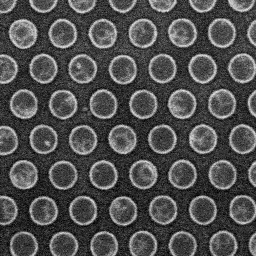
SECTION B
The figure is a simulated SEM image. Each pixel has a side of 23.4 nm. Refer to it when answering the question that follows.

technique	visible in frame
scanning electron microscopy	a regular array of raised bodies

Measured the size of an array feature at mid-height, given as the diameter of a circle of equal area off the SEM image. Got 629 nm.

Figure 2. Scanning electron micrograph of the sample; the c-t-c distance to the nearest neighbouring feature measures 0.924 microns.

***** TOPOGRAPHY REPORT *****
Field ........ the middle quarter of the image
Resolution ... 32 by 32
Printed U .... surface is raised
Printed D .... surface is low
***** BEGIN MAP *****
DUUUUUUUDDDDUUUUUUDDDUUUUUUUDDDU
DUUUUUUUDDDDUUUUUUDDDUUUUUUUDDDU
DDUUUUUUDDDDUUUUUUDDDDUUUUUUDDDD
DDUUUUUDDDDDUUUUUDDDDDUUUUUDDDDD
DDDDUDDDDDDDDUUUDDDDDDDDUDDDDDDD
DDDDDDDDDDDDDDDDDDDDDDDDDDDDDDDD
DDDDDDDDDDDDDDDDDDDDDDDDDDDDDDDD
UUDDDDDDUUUUDDDDDDUUUUDDDDDUUUUU
UUUDDDDUUUUUUDDDDUUUUUUDDDDUUUUU
UUUDDDDUUUUUUDDDDUUUUUUDDDUUUUUU
UUUDDDDUUUUUUDDDDUUUUUUDDDUUUUUU
UUUDDDDUUUUUUDDDDUUUUUUDDDDUUUUU
UUDDDDDDUUUUDDDDDDUUUUDDDDDUUUUU
DDDDDDDDDDDDDDDDDDDDDDDDDDDDDDDD
DDDDDDDDDDDDDDDDDDDDDDDDDDDDDDDD
DDDDDDDDDDDDDDDDDDDDDDDDUUDDDDDD
DDUUUUUDDDDDUUUUUDDDDDUUUUUDDDDD
DDUUUUUUDDDDUUUUUUDDDUUUUUUUDDDD
DDUUUUUUDDDUUUUUUUDDDUUUUUUUDDDD
DDUUUUUUDDDUUUUUUUDDDUUUUUUUDDDD
DDUUUUUUDDDDUUUUUUDDDDUUUUUDDDDD
DDDUUUUDDDDDDUUUUDDDDDDUUUUDDDDD
DDDDDDDDDDDDDDDDDDDDDDDDDDDDDDDD
DDDDDDDDDDDDDDDDDDDDDDDDDDDDDDDD
UDDDDDDDDUUDDDDDDDUUUDDDDDDDDUUD
UUDDDDDUUUUUDDDDDUUUUUDDDDDUUUUU
UUUDDDDUUUUUUDDDDUUUUUUDDDDUUUUU
UUUDDDDUUUUUUDDDDUUUUUUDDDUUUUUU
UUUDDDDUUUUUUDDDDUUUUUUDDDUUUUUU
UUUDDDDUUUUUUDDDDUUUUUUDDDDUUUUU
UUDDDDDDUUUUDDDDDDUUUUDDDDDDUUUD
DDDDDDDDDDDDDDDDDDDDDDDDDDDDDDDD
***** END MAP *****